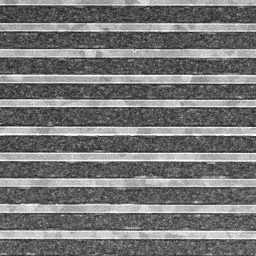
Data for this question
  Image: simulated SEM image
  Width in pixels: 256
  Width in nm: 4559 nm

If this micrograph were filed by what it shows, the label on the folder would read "parallel lines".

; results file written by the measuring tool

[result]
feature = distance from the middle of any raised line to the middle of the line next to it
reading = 0.463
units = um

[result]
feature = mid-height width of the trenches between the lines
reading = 325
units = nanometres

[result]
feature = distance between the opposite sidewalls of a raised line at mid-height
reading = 138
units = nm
